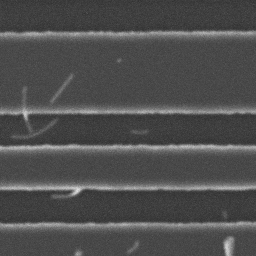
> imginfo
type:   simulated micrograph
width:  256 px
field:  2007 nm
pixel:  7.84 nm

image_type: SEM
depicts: lines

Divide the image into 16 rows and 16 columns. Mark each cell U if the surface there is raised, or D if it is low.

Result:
DDDDDDDDDDDDDDDD
DDDDDDDDDDDDDDDD
UUUUUUUUUUUUUUUU
UUUUUUUUUUUUUUUU
UUUUUUUUUUUUUUUU
UUUUUUUUUUUUUUUU
UUUUUUUUUUUUUUUU
DDDDDDDDDDDDDDDD
DDDDDDDDDDDDDDDD
UUUUUUUUUUUUUUUU
UUUUUUUUUUUUUUUU
UUUUUUUUUUUUUUUU
DDDDDDDDDDDDDDDD
DDDDDDDDDDDDDDDD
UUUUUUUUUUUUUUUU
UUUUUUUUUUUUUUUU